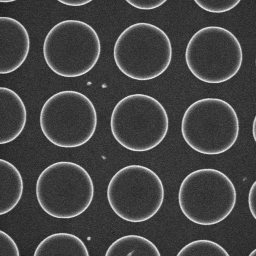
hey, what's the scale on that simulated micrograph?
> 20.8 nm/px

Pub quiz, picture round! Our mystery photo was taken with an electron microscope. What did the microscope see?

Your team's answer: an array of small figures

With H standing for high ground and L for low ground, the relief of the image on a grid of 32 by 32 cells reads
LLLLLLLLHHHLLLLLHHHHLLLLLHHHHHLL
LLLLLLLLLLLLLLLLLLLLLLLLLLLHLLLL
HHLLLLLLLLLLLLLLLLLLLLLLLLLLLLLL
HHHLLLLHHHHLLLLLHHHHLLLLLLHHLLLL
HHHHLLHHHHHHLLLHHHHHHLLLHHHHHLLL
HHHHLHHHHHHHLLHHHHHHHLLLHHHHHHLL
HHHLLHHHHHHHLLHHHHHHHLLHHHHHHHLL
HHHLLLHHHHHHLLHHHHHHHLLHHHHHHHLL
HHLLLLHHHHHLLLLHHHHHHLLLHHHHHHLL
LLLLLLLLHHLLLLLLHHHHLLLLHHHHHLLL
LLLLLLLLLLLLLLLLLLLLLLLLLLLLLLLL
HHLLLLLLHHLLLLLLLLLLLLLLLLLLLLLL
HHHLLLHHHHHLLLLHHHHLLLLLLHHHLLLL
HHHLLHHHHHHHLLHHHHHHLLLLHHHHHLLL
HHHLLHHHHHHHLLHHHHHHHLLHHHHHHHLL
HHHLLHHHHHHHLLHHHHHHHLLHHHHHHHLL
HHHLLHHHHHHHLLHHHHHHHLLHHHHHHHLL
HHLLLLHHHHHLLLLHHHHHLLLHHHHHHLLL
LLLLLLLLLLLLLLLLHHHLLLLLHHHHHLLL
LLLLLLLLLLLLLLLLLLLLLLLLLLLLLLLL
HLLLLLLHHHLLLLLLLLLLLLLLLLLLLLLL
HHLLLHHHHHHLLLLHHHHLLLLLHHHHLLLL
HHHLLHHHHHHLLLHHHHHHLLLHHHHHHLLL
HHHLLHHHHHHHLHHHHHHHLLLHHHHHHLLH
HHHLLHHHHHHHLHHHHHHHLLHHHHHHHLLH
HHLLLHHHHHHLLLHHHHHHLLHHHHHHHLLH
HLLLLLHHHHLLLLHHHHHHLLLHHHHHHLLH
LLLLLLLLLLLLLLLLHHLLLLLLHHHHLLLL
LLLLLLLLLLLLLLLLLLLLLLLLLLLLLLLL
HLLLLLHHHLLLLLLLHLLLLLLLLLLLLLLL
HHLLLHHHHHLLLLHHHHHLLLLLHHHLLLLL
HHLLHHHHHHHLLHHHHHHHLLHHHHHHLLLL